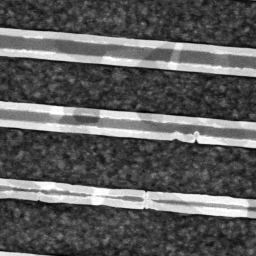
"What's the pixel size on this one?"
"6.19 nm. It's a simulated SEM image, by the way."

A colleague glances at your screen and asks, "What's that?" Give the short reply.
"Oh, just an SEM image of one or a few lines or trenches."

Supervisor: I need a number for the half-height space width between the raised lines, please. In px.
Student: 56.2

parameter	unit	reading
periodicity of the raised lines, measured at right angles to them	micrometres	0.452